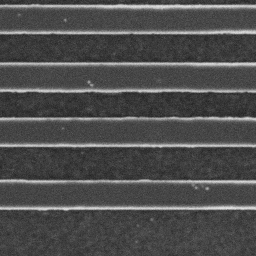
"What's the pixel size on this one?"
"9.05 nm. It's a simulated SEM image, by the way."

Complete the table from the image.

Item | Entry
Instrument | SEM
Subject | lines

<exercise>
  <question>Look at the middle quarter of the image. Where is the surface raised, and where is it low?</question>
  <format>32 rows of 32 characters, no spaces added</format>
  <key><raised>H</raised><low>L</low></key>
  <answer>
HHHHHHHHHHHHHHHHHHHHHHHHHHHHHHHH
HHHHHHHHHHHHHHHHHHHHHHHHHHHHHHHH
HHHHHHHHHHHHHHHHHHHHHHHHHHHHHHHH
HHHHHHHHHHHHHHHHHHHHHHHHHHHHHHHH
HHHHHHHHHHHHHHHHHHHHHHHHHHHHHHHH
HHHHHHHHHHHHHHHHHHHHHHHHHHHHHHHH
HHHHHHHHHHHHHHHHHHHHHHHHHHHHHHHH
LLLLLLLLLLLLLLLLLLLLLLLLLLLLLLLL
LLLLLLLLLLLLLLLLLLLLLLLLLLLLLLLL
LLLLLLLLLLLLLLLLLLLLLLLLLLLLLLLL
LLLLLLLLLLLLLLLLLLLLLLLLLLLLLLLL
LLLLLLLLLLLLLLLLLLLLLLLLLLLLLLLL
LLLLLLLLLLLLLLLLLLLLLLLLLLLLLLLL
LLLLLLLLLLLLLLLLLLLLLLLLLLLLLLLL
HHHHHHHHHHHHHHHHHHHHHHHHHHHHHHHH
HHHHHHHHHHHHHHHHHHHHHHHHHHHHHHHH
HHHHHHHHHHHHHHHHHHHHHHHHHHHHHHHH
HHHHHHHHHHHHHHHHHHHHHHHHHHHHHHHH
HHHHHHHHHHHHHHHHHHHHHHHHHHHHHHHH
HHHHHHHHHHHHHHHHHHHHHHHHHHHHHHHH
LHHHHHLHHHHHHHHHHHHHHHHHHHHHHHHH
LLLLLLLLLLLLLLLLLLLLLLLLLLLLLLLL
LLLLLLLLLLLLLLLLLLLLLLLLLLLLLLLL
LLLLLLLLLLLLLLLLLLLLLLLLLLLLLLLL
LLLLLLLLLLLLLLLLLLLLLLLLLLLLLLLL
LLLLLLLLLLLLLLLLLLLLLLLLLLLLLLLL
LLLLLLLLLLLLLLLLLLLLLLLLLLLLLLLL
LLLLLLLLLLLLLLLLLLLLLLLLLLLLLLLL
LLLLLLLLLLLLLLLLLLLLLLLLLLLLLLLL
HHHHHHHHHHHHHHHHHHHHHHHHHHHHHHHH
HHHHHHHHHHHHHHHHHHHHHHHHHHHHHHHH
HHHHHHHHHHHHHHHHHHHHHHHHHHHHHHHH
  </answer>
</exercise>